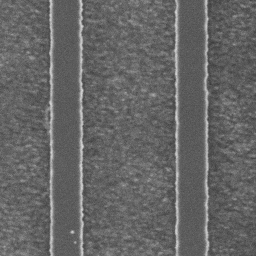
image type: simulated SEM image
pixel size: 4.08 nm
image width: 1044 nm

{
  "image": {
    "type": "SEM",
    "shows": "lines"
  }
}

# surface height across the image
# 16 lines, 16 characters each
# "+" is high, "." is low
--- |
...++......++...
...++......++...
...++......++...
...++......++...
...++......++...
...++......++...
...++......++...
...++......++...
...++......++...
...++......++...
...++......++...
...++......++...
...++......++...
...++......++...
...++......++...
...++......++...